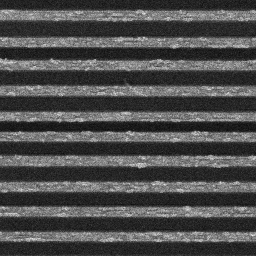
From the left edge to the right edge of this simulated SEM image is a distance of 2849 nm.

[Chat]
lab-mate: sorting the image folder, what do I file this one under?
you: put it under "parallel lines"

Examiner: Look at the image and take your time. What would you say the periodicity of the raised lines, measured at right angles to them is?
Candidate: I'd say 274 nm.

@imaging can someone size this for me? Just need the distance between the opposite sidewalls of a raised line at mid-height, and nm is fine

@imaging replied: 120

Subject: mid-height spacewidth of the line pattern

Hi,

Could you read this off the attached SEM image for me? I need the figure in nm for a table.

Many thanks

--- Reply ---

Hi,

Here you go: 160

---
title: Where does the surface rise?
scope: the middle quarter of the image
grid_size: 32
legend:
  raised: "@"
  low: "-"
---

@@@@@@@@@@@@@@@@@@@@@@@@@@@@@@@@
@@@@@@@@@@@@@@@@@@@@@@@@@@@@@@@@
--------------------------------
--------------------------------
--------------------------------
---------------@@---------------
@@@@@@@@@@@@@@@@@@@@@@@@@@@@@@@@
@@@@@@@@@@@@@@@@@@@@@@@@@@@@@@@@
--------------------------------
--------------------------------
--------------------------------
--------------------------------
@@@@@@@@@@@@@@@@@@@@@@@@@@@@@@@@
@@@@@@@@@@@@@@@@@@@@@@@@@@@@@@@@
--------------------------------
--------------------------------
--------------------------------
@@@@@@@@@@@@@@@@@@@@@@@@@@@@@@@@
@@@@@@@@@@@@@@@@@@@@@@@@@@@@@@@@
---------------------------@@@@@
--------------------------------
--------------------------------
--------------------------------
@@@@@@@@@@@@@@@@@@@@@@@@@@@@@@@@
@@@@@@@@@@@@@@@@@@@@@@@@@@@@@@@@
@@@@@@@@@@@@@@@@@@@@@@@@@@@@@@@@
--------------------------------
--------------------------------
--------------------------------
----------------------@@--------
@@@@@@@@@@@@@@@@@@@@@@@@@@@@@@@@
@@@@@@@@@@@@@@@@@@@@@@@@@@@@@@@@